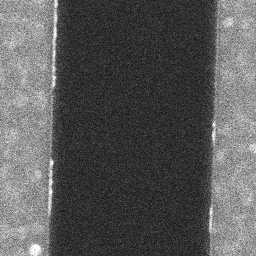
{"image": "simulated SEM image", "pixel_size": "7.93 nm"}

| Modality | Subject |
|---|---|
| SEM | one or a few lines or trenches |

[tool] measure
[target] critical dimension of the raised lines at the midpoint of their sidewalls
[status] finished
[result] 1300 nanometers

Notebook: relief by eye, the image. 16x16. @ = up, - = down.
---@@@@@@@@@@@--
---@@@@@@@@@@@--
---@@@@@@@@@@@--
---@@@@@@@@@@@--
---@@@@@@@@@@@--
---@@@@@@@@@@@--
---@@@@@@@@@@---
---@@@@@@@@@@---
---@@@@@@@@@@---
---@@@@@@@@@@---
---@@@@@@@@@@---
---@@@@@@@@@@---
---@@@@@@@@@@---
---@@@@@@@@@@---
---@@@@@@@@@@---
---@@@@@@@@@@---